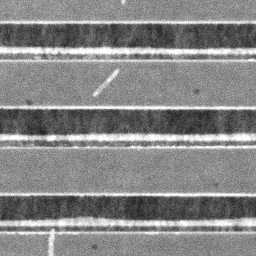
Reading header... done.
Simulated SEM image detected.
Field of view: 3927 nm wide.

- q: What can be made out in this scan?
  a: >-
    lines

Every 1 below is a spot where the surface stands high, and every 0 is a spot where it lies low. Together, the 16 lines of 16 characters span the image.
1111111111111111
0000000000000000
0000000000000000
1111111111111111
1111111111111111
1111111111111111
1111111111111111
0000000000000000
0000000000000000
1111111111111111
1111111111111111
1111111111111111
0000000000000000
0000000000000000
1111111111111111
1111111111111111